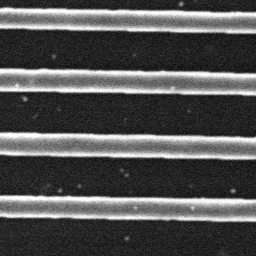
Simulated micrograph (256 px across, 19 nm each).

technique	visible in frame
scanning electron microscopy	lines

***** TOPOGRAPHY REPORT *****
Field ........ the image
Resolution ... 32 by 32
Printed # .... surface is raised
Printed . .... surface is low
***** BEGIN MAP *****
................................
#######################.........
################################
...#############################
................................
................................
................................
................................
................................
################################
################################
................################
................................
................................
................................
................................
................................
################################
################################
.............###################
................................
................................
................................
................................
................................
################################
################################
..........................######
................................
................................
................................
................................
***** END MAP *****